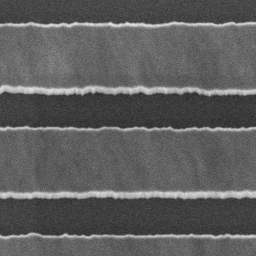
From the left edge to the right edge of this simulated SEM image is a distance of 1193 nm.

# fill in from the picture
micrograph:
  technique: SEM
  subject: lines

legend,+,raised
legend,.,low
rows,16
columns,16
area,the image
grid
................
++..+++++.+++.++
++++++++++++++++
++++++++++++++++
++++++++++++++++
++++++++++++++++
................
................
++++++++++++++++
++++++++++++++++
++++++++++++++++
++++++++++++++++
................
................
................
++++++++++++++++